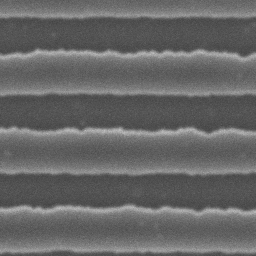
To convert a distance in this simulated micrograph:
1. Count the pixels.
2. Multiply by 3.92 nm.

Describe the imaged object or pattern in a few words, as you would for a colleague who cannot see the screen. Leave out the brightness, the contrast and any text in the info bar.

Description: lines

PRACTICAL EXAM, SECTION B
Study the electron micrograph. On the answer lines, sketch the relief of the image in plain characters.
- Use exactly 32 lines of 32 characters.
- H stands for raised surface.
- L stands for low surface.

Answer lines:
HHHHHHHHHHHHHHHHHHHHHHHHHHHHHHHH
HHHHHHHHHHHHHHHHHHHHHHHHHHHHHHHH
LLLLLLLLLLLLLLLLLLLLLLLLLLLLLLLL
LLLLLLLLLLLLLLLLLLLLLLLLLLLLLLLL
LLLLLLLLLLLLLLLLLLLLLLLLLLLLLLLL
LLLLLLLLLLLLLLLLLLLLLLLLLLLLLLLL
LLLLHHHHHHHHLHLLLLLLLLLLHHLLLLLL
HHHHHHHHHHHHHHHHHHHHHHHHHHHHHHHH
HHHHHHHHHHHHHHHHHHHHHHHHHHHHHHHH
HHHHHHHHHHHHHHHHHHHHHHHHHHHHHHHH
HHHHHHHHHHHHHHHHHHHHHHHHHHHHHHHH
HHHHHHHHHHHHHHHHHHHHHHHHHHHHHHHH
LLLLLLLLLLLLLLLLLLLLLLLLLLLLLLLL
LLLLLLLLLLLLLLLLLLLLLLLLLLLLLLLL
LLLLLLLLLLLLLLLLLLLLLLLLLLLLLLLL
LLLLLLLLLLLLLLLLLLLLLLLLLLLLLLLL
HHHHHLHHHHHHHHHHHHLLHHHHHLLHHHHL
HHHHHHHHHHHHHHHHHHHHHHHHHHHHHHHH
HHHHHHHHHHHHHHHHHHHHHHHHHHHHHHHH
HHHHHHHHHHHHHHHHHHHHHHHHHHHHHHHH
HHHHHHHHHHHHHHHHHHHHHHHHHHHHHHHH
HHHHHHHHHHHHHHHHHHHHHHHHHHHHHHHL
LLLLLLLLLLLLLLLLLLLLLLLLLLLLLLLL
LLLLLLLLLLLLLLLLLLLLLLLLLLLLLLLL
LLLLLLLLLLLLLLLLLLLLLLLLLLLLLLLL
LLLLLLLLLLLLLLLLLLLLLLLLLLLLLLLL
HHHHHHHHHHHHHHHHHHHHHHHHHHHHHHHH
HHHHHHHHHHHHHHHHHHHHHHHHHHHHHHHH
HHHHHHHHHHHHHHHHHHHHHHHHHHHHHHHH
HHHHHHHHHHHHHHHHHHHHHHHHHHHHHHHH
HHHHHHHHHHHHHHHHHHHHHHHHHHHHHHHH
HHHLLLLLLLLLLLLLLLLLLLLLLLLLHHHH